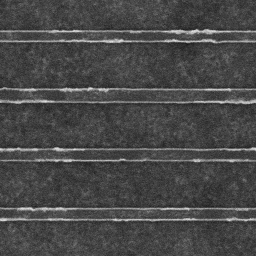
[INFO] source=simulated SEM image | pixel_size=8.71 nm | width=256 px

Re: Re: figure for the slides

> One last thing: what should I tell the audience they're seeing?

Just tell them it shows parallel lines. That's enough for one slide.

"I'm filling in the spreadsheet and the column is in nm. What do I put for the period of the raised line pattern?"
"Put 517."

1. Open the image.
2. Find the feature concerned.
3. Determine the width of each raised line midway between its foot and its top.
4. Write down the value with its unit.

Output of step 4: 106 nanometres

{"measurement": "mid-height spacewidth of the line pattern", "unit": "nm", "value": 406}